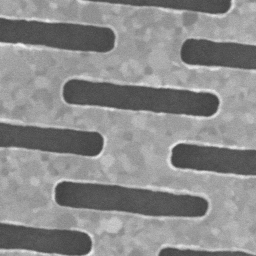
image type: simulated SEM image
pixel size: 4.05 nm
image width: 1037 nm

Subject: holes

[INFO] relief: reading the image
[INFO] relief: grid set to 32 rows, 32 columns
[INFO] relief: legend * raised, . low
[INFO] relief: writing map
***************..............***
*************************...****
...*****************************
..............******************
..............******************
***...........*********........*
***********..**********.........
***********************.........
****************************....
********************************
********........****************
********................*.******
********...................*****
**************.............*****
************************..******
...*****************************
............********************
.............*******************
*............*********.......***
**********..*********...........
**********************..........
***************************.....
********************************
*******..........***************
*******..................*******
*******...................******
**************............******
********************************
......**************************
...........*********************
............********************
*****......*********...........*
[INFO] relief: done